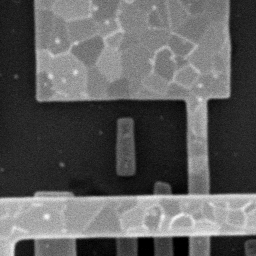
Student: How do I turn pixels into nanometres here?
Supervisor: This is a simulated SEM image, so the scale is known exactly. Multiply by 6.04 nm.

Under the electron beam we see wiring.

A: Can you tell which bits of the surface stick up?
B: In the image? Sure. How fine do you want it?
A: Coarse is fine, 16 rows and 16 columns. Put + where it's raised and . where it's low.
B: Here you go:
................
................
................
................
................
................
................
................
................
................
................
................
++++++++++++++++
++++++++++++++++
++++++++++++++++
+...............